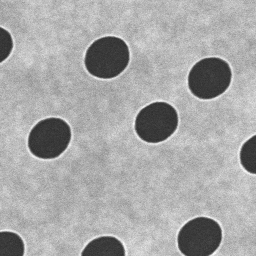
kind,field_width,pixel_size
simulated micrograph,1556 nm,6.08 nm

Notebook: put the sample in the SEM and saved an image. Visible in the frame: holes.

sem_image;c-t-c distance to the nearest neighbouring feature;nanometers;457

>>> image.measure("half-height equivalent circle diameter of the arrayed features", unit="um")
0.255